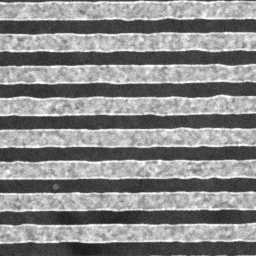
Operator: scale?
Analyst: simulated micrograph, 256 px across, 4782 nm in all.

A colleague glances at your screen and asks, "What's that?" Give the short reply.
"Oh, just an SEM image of wiring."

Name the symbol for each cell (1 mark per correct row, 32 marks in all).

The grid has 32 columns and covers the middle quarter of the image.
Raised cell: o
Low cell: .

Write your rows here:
...........................oooo.
oooooooooooooooooooooooooooooooo
oooooooooooooooooooooooooooooooo
oooooooooooooooooooooooooooooooo
oooooooo...oooooooooooooooooooo.
................................
................................
................................
......ooooo..oo....oooo...oooo..
oooooooooooooooooooooooooooooooo
oooooooooooooooooooooooooooooooo
oooooooooooooooooooooooooooooooo
oooo...................oooo.....
................................
................................
................................
...........oo.........oooo.ooooo
oooooooooooooooooooooooooooooooo
oooooooooooooooooooooooooooooooo
oooooooooooooooooooooooooooooooo
oo......oooooooooooooo.........o
................................
................................
................................
............o.ooooo.ooooo..ooooo
oooooooooooooooooooooooooooooooo
oooooooooooooooooooooooooooooooo
oooooooooooooooooooooooooooooooo
ooooooo...ooooo...oo..oooo...oo.
................................
................................
................................